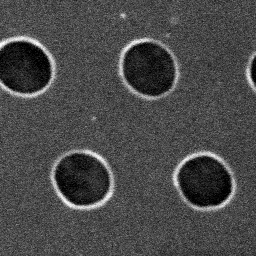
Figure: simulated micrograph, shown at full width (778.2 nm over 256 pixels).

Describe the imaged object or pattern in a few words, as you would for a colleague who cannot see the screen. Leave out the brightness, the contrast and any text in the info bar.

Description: holes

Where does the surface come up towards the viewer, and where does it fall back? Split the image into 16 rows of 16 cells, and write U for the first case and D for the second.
UUUUUUUUUUUUUUUU
UUUUUUUUUUUUUUUU
UUUUUUUUUUUUUUUU
DDDUUUUUDDDUUUUU
DDDUUUUUDDDUUUUU
UDDUUUUUDDDUUUUU
UUUUUUUUUUUUUUUU
UUUUUUUUUUUUUUUU
UUUUUUUUUUUUUUUU
UUUUUUUUUUUUUUUU
UUUDDDDUUUUDDDUU
UUUUDDDUUUUDDDUU
UUUUDDUUUUUUDDUU
UUUUUUUUUUUUUUUU
UUUUUUUUUUUUUUUU
UUUUUUUUUUUUUUUU